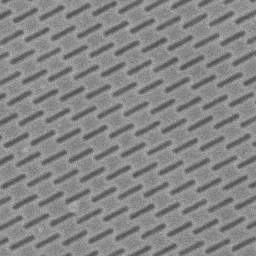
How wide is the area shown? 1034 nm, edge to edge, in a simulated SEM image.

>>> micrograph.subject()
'a regular array of holes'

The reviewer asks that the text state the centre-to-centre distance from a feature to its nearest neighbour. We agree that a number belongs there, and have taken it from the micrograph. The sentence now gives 91.6 nanometers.